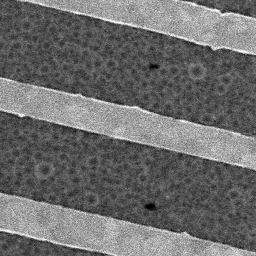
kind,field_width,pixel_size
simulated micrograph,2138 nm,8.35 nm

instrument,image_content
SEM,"one or a few lines or trenches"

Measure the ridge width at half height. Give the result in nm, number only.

268